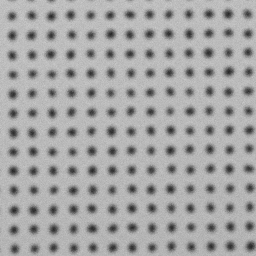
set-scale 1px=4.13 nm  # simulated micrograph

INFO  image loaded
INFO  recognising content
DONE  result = a regular array of holes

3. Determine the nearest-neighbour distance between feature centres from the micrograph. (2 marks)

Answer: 78.7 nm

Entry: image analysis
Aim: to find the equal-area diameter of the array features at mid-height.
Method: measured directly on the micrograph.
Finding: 34.7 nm